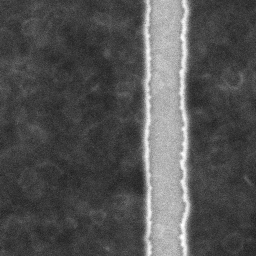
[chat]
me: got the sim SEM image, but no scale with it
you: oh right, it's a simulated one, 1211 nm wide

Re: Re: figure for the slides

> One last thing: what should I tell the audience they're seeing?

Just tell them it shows one or a few lines or trenches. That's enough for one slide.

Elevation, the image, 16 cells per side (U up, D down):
UUUUUUUUUDDDUUUU
UUUUUUUUUDDUUUUU
UUUUUUUUUDDUUUUU
UUUUUUUUUDDUUUUU
UUUUUUUUUDDUUUUU
UUUUUUUUUDDUUUUU
UUUUUUUUUDDUUUUU
UUUUUUUUUDDUUUUU
UUUUUUUUUDDDUUUU
UUUUUUUUUDDUUUUU
UUUUUUUUUDDUUUUU
UUUUUUUUUDDUUUUU
UUUUUUUUUDDDUUUU
UUUUUUUUUDDDUUUU
UUUUUUUUUDDUUUUU
UUUUUUUUUDDUUUUU